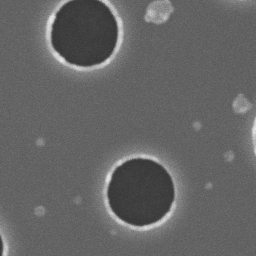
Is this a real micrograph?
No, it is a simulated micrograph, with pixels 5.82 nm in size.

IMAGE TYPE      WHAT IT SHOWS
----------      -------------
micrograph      holes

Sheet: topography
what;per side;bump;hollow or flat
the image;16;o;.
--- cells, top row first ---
oooo...ooooooooo
ooo....ooooooooo
ooo....ooooooooo
oooo...ooooooooo
oooooooooooooooo
oooooooooooooooo
oooooooooooooooo
oooooooooooooooo
oooooooooooooooo
oooooooooooooooo
ooooooo...oooooo
ooooooo....ooooo
ooooooo....ooooo
ooooooo...oooooo
oooooooooooooooo
oooooooooooooooo